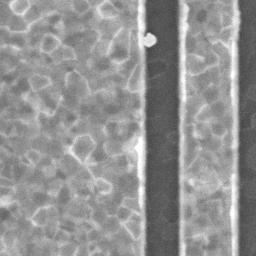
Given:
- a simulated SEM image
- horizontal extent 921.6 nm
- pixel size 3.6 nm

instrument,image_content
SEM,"one or a few lines or trenches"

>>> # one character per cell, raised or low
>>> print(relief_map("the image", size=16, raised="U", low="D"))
UUUUUUUUUDDUUUUD
UUUUUUUUUDDUUUUD
UUUUUUUUUDDUUUUD
UUUUUUUUUDDUUUUD
UUUUUUUUUDDUUUUD
UUUUUUUUUDDUUUUD
UUUUUUUUUDDUUUUD
UUUUUUUUUDDUUUUD
UUUUUUUUUDDUUUUD
UUUUUUUUUDDUUUUD
UUUUUUUUUDDUUUUD
UUUUUUUUUDDUUUUD
UUUUUUUUUDDUUUUD
UUUUUUUUUDDUUUUD
UUUUUUUUUDDUUUUD
UUUUUUUUUDDUUUUD